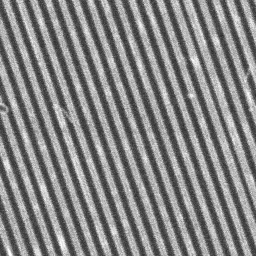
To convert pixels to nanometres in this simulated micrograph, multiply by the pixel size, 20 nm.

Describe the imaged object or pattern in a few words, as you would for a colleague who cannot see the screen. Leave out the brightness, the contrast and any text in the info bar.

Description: parallel lines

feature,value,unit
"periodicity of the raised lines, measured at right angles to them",0.264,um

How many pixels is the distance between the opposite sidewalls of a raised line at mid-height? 9.68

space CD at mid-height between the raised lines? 73.2 nanometres